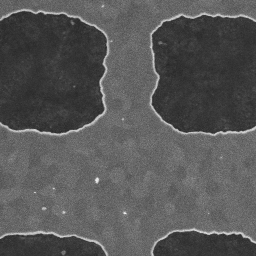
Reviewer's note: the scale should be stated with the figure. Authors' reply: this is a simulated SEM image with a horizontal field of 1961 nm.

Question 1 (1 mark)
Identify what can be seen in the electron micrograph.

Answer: holes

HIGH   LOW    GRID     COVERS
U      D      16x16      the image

UUUUUUUUUUUUUUUU
DDDDDDUUUUDDDDDD
DDDDDDDUUDDDDDDD
DDDDDDDUUUDDDDDD
DDDDDDUUUUDDDDDD
DDDDDDUUUUDDDDDD
DDDDDDUUUUDDDDDD
DDDDDDUUUUDDDDDD
UUUUUUUUUUUUUUUU
UUUUUUUUUUUUUUUU
UUUUUUUUUUUUUUUU
UUUUUUUUUUUUUUUU
UUUUUUUUUUUUUUUU
UUUUUUUUUUUUUUUU
UUUUUUUUUUUDDUUU
DDDDDDUUUUDDDDDD